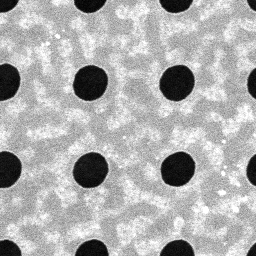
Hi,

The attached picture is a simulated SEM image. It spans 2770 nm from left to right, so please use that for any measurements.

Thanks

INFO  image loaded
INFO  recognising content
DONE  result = holes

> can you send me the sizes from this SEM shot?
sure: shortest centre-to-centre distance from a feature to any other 936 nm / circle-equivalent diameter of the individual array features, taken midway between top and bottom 387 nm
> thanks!